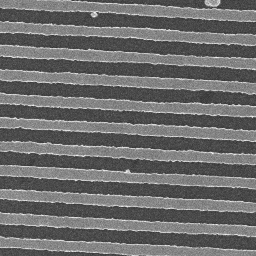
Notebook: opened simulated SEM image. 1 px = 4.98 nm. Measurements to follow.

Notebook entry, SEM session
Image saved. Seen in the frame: parallel lines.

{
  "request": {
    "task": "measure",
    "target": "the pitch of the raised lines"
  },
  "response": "0.119 microns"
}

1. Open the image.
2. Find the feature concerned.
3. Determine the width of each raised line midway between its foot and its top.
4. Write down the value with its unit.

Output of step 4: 50.9 nm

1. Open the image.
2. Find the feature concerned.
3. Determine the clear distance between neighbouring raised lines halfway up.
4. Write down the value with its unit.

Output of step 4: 67.1 nanometers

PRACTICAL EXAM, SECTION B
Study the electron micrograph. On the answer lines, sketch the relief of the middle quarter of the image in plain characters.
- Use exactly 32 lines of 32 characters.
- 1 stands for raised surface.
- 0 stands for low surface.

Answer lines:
00000000000000000000000000000000
00000000000000000000000000000000
11111100000000000000000000000000
11111111111111111111111110000000
11111111111111111111111111111111
00000000000010011111111111111111
00000000000000000000000000000000
00000000000000000000000000000000
01111000000000000000000000000000
11111111111111111110000000000000
11111111111111111111111111111111
00000000000011101111111111111111
00000000000000000000000000000001
00000000000000000000000000000000
11111100000000000000000000000000
11111111111111111111111111110010
11111111111111111111111111111111
00000000000000000011111111111111
00000000000000000000000000000000
00000000000000000000000000000000
11110000010000000000000000000000
11111111111111111111111110000000
11111111111111111111111111111111
00000000000010011111111111111111
00000000000000000000000000000000
00000000000000000000000000000000
11111001000000000000000000000000
11111111111111111110001011100000
11111111111111111111111111111111
00000000000001001111111111111111
00000000000000000000000000000000
00000000000000000000000000000000